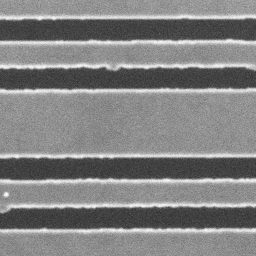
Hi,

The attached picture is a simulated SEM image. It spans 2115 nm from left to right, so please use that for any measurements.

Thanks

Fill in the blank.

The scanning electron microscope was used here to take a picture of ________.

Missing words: lines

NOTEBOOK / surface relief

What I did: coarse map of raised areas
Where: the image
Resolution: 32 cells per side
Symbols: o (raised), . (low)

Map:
oooooooooooooooooooooooooooooooo
oooooooooooooooooooooooooooooooo
................................
................................
................................
oooooooooooooooooooooooooooooooo
oooooooooooooooooooooooooooooooo
oooooooooooooooooooooooooooooooo
o.oooo..o.....o.o.o.............
................................
................................
oooooooooooooooooooooooooooooooo
oooooooooooooooooooooooooooooooo
oooooooooooooooooooooooooooooooo
oooooooooooooooooooooooooooooooo
oooooooooooooooooooooooooooooooo
oooooooooooooooooooooooooooooooo
oooooooooooooooooooooooooooooooo
oooooooooooooooooooooooooooooooo
oooooooooooooooooooooooooooooooo
................................
................................
..........ooo.......o....oooo.oo
oooooooooooooooooooooooooooooooo
oooooooooooooooooooooooooooooooo
oooooooooooooooooooooooooooooooo
o...............................
................................
................................
oooooooooooooooooooooooooooooooo
oooooooooooooooooooooooooooooooo
oooooooooooooooooooooooooooooooo